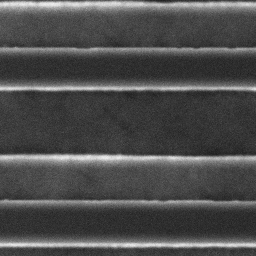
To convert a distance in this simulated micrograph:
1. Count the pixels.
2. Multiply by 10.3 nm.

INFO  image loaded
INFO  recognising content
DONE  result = lines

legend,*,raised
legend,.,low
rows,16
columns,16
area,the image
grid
****************
****************
****************
****************
****************
................
................
................
................
................
****************
****************
****************
****************
****************
................